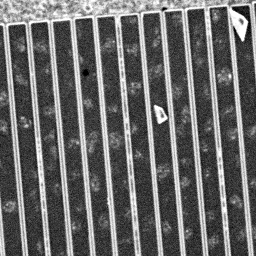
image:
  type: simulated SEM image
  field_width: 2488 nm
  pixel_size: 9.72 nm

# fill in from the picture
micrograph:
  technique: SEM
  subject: parallel lines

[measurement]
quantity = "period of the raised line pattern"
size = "219 nm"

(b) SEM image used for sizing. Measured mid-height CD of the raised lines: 37.6 nm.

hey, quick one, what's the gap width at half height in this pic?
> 18.3 px